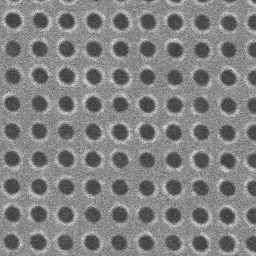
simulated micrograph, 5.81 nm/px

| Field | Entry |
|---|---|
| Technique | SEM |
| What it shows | a regular array of holes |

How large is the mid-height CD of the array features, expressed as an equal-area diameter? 0.0968 um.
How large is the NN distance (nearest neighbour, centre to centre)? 0.156 microns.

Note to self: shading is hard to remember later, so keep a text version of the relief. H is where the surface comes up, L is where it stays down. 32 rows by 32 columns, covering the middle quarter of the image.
HHHHHHHHHHHHHHHHHHHHHHHHHHHHHHHH
LLHHHHLLHHHHHLLHHHHHLLHHHHHLLHHH
LLLHHLLLLHHHLLLLHHHLLLLHHHLLLLHH
LLLHHHLLLLHHLLLLHHHLLLLHHHLLLLHH
LLHHHHLLLHHHHLLLHHHLLLLHHHLLLLHH
HHHHHHHHHHHHHHHHHHHHHHHHHHHHHHHH
HHHHHHHHHHHHHHHHHHHHHHHHHHHHHHHH
HHHHHHHHHHHHHHHHHHHHHHHHHHHHHHHH
LLHHHHLLLHHHHLLHHHHLLLHHHHLLLHHH
LLHHHLLLLHHHLLLLHHHLLLLHHHLLLLHH
LLLHHLLLLLHHLLLLHHHLLLLHHLLLLLHH
LLHHHHLLLHHHHLLLHHHLLLLHHHLLLLHH
HHHHHHHHHHHHHHHHHHHHHHHHHHHHHHHH
HHHHHHHHHHHHHHHHHHHHHHHHHHHHHHHH
HHHHHHHHHHHHHHHHHHHHHHHHHHHHHHHH
LLHHHHLLLHHHLLLHHHHLLLHHHHLLLHHH
LLLHHLLLLHHHLLLLHHHLLLLHHLLLLHHH
LLLHHLLLLLHHLLLLHHHLLLLHHLLLLLHH
LLHHHHLLLHHHHLLLHHHLLLHHHHLLLHHH
HHHHHHHHHHHHHHHHHHHHHHHHHHHHHHHH
HHHHHHHHHHHHHHHHHHHHHHHHHHHHHHHH
LHHHHHHHHHHHHHHHHHHHHHHHHHHHHHHH
LLHHHHLLHHHHLLLHHHHLLLHHHHLLLHHH
LLLHHLLLLHHHLLLLHHHLLLLHHLLLLHHH
LLHHHLLLLHHHLLLLHHHLLLLHHLLLLLHH
LLHHHHLLLHHHHLLLHHHLLLHHHHLLLHHH
HHHHHHHHHHHHHHHHHHHHHHHHHHHHHHHH
HHHHHHHHHHHHHHHHHHHHHHHHHHHHHHHH
HHHHHHHHHHHHHHHHHHHHHHHHHHHHHHHH
LLHHHHLLLHHHLLLLHHHLLLHHHHLLLHHH
LLLHHLLLLHHHLLLLHHHLLLLHHLLLLHHH
LLLHHLLLLHHHLLLLHHHLLLLHHHLLLLHH